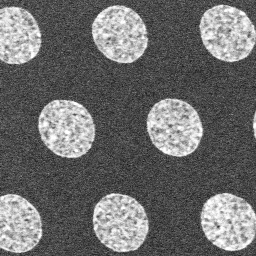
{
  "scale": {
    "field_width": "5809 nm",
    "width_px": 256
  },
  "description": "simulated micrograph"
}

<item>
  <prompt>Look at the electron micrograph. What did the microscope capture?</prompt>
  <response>raised bodies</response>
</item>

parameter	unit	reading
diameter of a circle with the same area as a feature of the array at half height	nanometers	1230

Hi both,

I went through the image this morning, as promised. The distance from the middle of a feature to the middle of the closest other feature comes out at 2.44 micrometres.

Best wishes